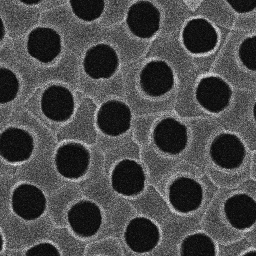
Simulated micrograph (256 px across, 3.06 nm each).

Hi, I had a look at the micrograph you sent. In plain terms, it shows a regular array of holes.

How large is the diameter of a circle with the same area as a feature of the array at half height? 105 nm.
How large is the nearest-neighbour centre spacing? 180 nm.